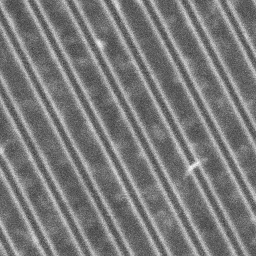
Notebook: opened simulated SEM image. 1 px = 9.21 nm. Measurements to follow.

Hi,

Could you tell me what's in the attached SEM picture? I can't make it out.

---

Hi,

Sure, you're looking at parallel lines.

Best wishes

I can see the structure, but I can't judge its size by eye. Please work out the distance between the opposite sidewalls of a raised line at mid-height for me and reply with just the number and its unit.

232 nanometers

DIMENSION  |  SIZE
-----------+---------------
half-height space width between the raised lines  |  75.5 nm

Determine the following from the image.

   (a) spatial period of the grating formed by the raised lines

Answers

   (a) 312 nm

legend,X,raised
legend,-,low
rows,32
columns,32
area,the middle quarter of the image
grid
--XXXXXXX--XXXXXXX---XXXXXXX--XX
--XXXXXXX---XXXXXXX--XXXXXXX---X
---XXXXXXX--XXXXXXX---XXXXXXX--X
X--XXXXXXX---XXXXXXX--XXXXXXX---
X---XXXXXXX--XXXXXXX---XXXXXXX--
XX--XXXXXXX---XXXXXXX--XXXXXXX--
XX---XXXXXXX--XXXXXXX---XXXXXXX-
XXX--XXXXXXX---XXXXXXX--XXXXXXX-
XXX---XXXXXXX---XXXXXX---XXXXXXX
XXXX--XXXXXXX---XXXXXXX--XXXXXXX
XXXX---XXXXXXX---XXXXXX---XXXXXX
XXXXX--XXXXXXX---XXXXXXX--XXXXXX
XXXXX---XXXXXXX---XXXXXX---XXXXX
XXXXXX--XXXXXXX---XXXXXXX---XXXX
XXXXXX---XXXXXXX---XXXXXXX--XXXX
XXXXXXX---XXXXXXX--XXXXXXX---XXX
XXXXXXX---XXXXXXX---XXXXXX---XXX
-XXXXXXX---XXXXXXX--XXXXXXX---XX
-XXXXXXX---XXXXXXX---XXXXXXX--XX
--XXXXXXX---XXXXXXX--XXXXXXX---X
---XXXXXXX--XXXXXXX---XXXXXXX--X
X--XXXXXXX---XXXXXXX--XXXXXXX---
X---XXXXXXX--XXXXXXX---XXXXXXX--
XX--XXXXXXX---XXXXXXX--XXXXXXX--
XX---XXXXXXX--XXXXXXX---XXXXXXX-
XXX--XXXXXXX---XXXXXXX--XXXXXXX-
XXX---XXXXX-X--XXXXXXX---XXXXXXX
XXXX--XXXX--X---XXXXXXX--XXXX-XX
XXXX---XXXXXXX--XXXXXXX---XXX-XX
XXXXX--XXXXXXX---XXXXXXX--XXXXXX
XXXXX---XXXXXXX--XXXXXXX---XXXXX
XXXXXX--XXXXXXX---XXXXXXX--X-XXX